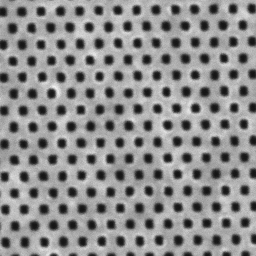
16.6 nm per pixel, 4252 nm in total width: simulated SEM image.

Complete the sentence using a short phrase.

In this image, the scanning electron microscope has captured a regular array of holes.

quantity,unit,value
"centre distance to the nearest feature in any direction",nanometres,312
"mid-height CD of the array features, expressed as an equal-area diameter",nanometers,182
